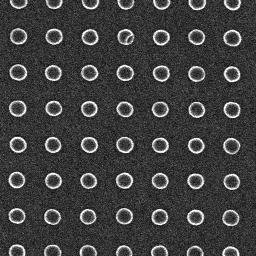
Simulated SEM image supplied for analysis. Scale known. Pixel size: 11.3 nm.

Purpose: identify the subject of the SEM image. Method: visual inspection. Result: a regular array of raised bodies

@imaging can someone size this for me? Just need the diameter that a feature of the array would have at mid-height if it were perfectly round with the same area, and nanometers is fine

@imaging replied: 177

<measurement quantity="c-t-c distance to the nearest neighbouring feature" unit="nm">399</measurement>